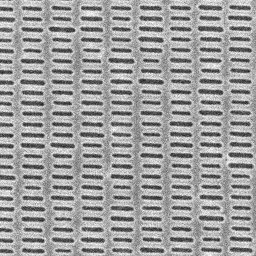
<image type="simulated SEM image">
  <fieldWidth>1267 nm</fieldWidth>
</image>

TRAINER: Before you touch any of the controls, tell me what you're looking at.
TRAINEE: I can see a regular array of holes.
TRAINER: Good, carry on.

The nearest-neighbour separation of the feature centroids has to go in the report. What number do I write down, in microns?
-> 0.0506